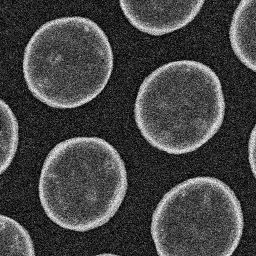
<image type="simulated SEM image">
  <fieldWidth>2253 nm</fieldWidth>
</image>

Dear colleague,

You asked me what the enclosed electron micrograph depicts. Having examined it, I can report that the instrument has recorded raised bodies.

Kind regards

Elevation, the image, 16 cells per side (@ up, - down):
--------@@@@---@
---@@@--@@@@---@
--@@@@@--------@
--@@@@@--------@
-@@@@@@---@@@---
--@@@@---@@@@@--
---@@----@@@@@--
@--------@@@@@--
@--------@@@@---
@--@@@@----@----
---@@@@@--------
--@@@@@@---@@@--
---@@@@---@@@@@-
---@@@@---@@@@@-
@@--------@@@@@-
@@--------@@@@@-